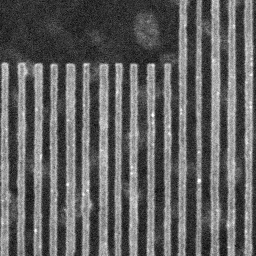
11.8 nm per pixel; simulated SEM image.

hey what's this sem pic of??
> parallel lines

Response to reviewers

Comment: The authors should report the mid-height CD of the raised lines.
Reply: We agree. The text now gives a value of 0.137 µm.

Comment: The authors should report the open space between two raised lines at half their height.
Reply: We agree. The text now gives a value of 62 nm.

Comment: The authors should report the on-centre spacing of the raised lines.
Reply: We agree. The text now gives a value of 191 nanometers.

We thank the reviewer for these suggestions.